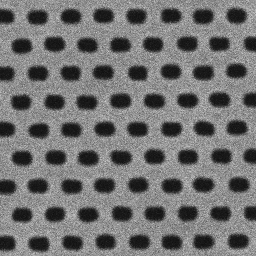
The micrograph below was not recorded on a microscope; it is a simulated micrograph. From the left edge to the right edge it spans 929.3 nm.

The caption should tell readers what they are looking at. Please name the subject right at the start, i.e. a regular array of holes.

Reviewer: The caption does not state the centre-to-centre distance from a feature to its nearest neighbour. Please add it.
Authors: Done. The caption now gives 116 nanometers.